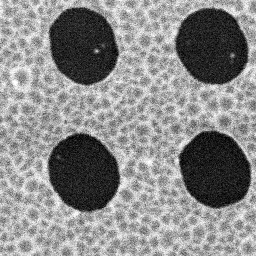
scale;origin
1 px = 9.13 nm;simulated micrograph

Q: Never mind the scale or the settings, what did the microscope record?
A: holes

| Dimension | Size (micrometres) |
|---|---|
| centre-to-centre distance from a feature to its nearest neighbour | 1.14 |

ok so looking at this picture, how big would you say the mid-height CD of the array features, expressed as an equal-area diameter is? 688 nm